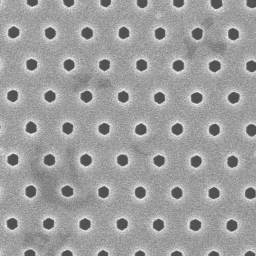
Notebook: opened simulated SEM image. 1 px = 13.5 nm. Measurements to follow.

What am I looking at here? a regular array of holes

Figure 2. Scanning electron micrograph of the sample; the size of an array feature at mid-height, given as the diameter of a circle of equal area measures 159 nanometers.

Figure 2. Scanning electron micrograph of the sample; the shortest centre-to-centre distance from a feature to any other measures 490 nm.